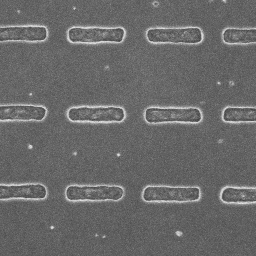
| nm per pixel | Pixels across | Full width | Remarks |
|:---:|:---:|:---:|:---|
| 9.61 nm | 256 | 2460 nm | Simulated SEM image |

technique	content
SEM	holes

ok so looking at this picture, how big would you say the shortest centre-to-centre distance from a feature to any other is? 738 nm